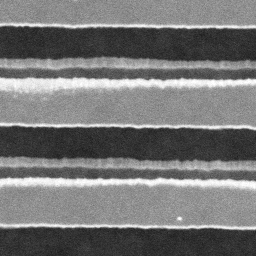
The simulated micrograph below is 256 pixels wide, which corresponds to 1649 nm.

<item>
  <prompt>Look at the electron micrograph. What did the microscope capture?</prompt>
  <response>lines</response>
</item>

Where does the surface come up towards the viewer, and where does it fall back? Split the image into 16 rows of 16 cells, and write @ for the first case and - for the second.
@@@@@@@@@@@@@@@@
@@@@@@@@@@@@@@@@
----------------
----------------
@@@@@@@@@@@@@@@@
@@@@@@@@@@@@@@@@
@@@@@@@@@@@@@@@@
@@@@@@@@@@@@@@@@
----------------
----------------
@@@@@@@@@@@@----
@@@@@@@@@@@@@@@@
@@@@@@@@@@@@@@@@
@@@@@@@@@@@@@@@@
----------------
----------------